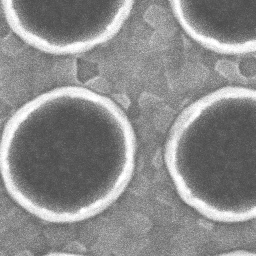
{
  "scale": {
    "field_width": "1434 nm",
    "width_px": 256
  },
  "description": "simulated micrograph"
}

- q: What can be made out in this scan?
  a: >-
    raised bodies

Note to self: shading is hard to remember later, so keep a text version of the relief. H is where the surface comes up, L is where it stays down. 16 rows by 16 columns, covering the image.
HHHHHHHHLLLHHHHH
LHHHHHHLLLLLHHHH
LLHHHHLLLLLLLHHH
LLLLLLLLLLLLLLLL
LLLLLLLLLLLLLLLL
LLLLLLLLLLLLLLLL
LLHHHHHLLLLLHHHH
LHHHHHHHLLLHHHHH
HHHHHHHHLLLHHHHH
HHHHHHHHLLLHHHHH
HHHHHHHHLLLHHHHH
LHHHHHHHLLLHHHHH
LHHHHHHLLLLLHHHH
LLLHHLLLLLLLLHHL
LLLLLLLLLLLLLLLL
LLLLLLLLLLLLLLLL